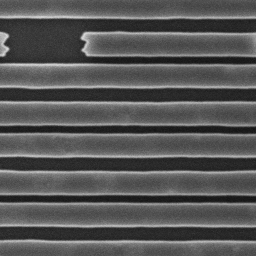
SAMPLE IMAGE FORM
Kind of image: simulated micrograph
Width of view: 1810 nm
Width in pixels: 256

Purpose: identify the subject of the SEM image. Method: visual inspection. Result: parallel lines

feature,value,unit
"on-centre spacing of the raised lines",242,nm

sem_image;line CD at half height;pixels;22.6